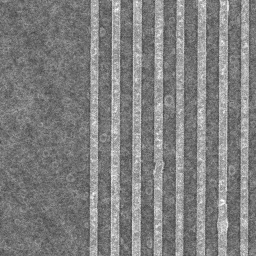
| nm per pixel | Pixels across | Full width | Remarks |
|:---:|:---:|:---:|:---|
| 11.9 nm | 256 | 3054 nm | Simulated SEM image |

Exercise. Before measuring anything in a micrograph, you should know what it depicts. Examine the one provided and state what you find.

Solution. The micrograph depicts parallel lines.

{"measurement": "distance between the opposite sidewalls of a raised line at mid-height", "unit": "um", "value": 0.088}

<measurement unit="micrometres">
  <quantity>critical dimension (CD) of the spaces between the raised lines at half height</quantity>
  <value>0.166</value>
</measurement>